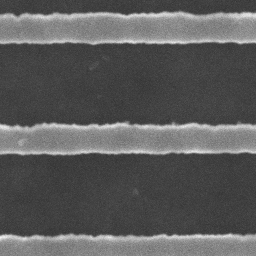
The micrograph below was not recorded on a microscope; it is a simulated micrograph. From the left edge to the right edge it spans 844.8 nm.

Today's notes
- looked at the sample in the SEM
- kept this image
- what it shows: lines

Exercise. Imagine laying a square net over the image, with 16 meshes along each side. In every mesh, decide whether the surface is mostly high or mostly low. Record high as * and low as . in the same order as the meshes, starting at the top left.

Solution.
................
****************
****************
................
................
................
................
................
****************
****************
................
................
................
................
................
****************